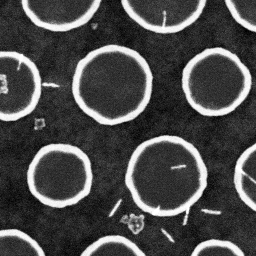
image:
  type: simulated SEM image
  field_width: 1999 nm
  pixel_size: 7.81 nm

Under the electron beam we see raised bodies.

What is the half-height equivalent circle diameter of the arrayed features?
68.4 px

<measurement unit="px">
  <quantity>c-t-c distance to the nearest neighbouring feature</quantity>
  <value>104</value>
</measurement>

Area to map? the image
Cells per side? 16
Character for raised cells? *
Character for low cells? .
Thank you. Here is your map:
..****..*****.**
...**....***...*
................
*.....***....*..
**...****...***.
**...****...***.
**...****...***.
......**........
................
...**....***....
..****..*****..*
..****..*****..*
...**....***...*
................
................
**....**.....**.